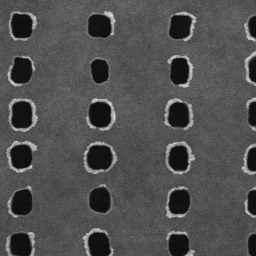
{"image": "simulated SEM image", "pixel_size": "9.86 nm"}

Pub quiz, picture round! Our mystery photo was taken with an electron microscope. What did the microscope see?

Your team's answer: a regular array of holes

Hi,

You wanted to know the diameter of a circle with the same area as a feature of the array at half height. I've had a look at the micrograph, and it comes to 0.234 µm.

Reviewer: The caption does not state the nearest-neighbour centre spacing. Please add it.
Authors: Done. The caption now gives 0.428 micrometres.